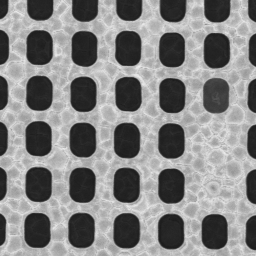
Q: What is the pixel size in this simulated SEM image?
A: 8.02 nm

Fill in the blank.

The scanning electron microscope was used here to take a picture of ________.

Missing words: a regular array of holes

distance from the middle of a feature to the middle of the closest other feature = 0.353 microns